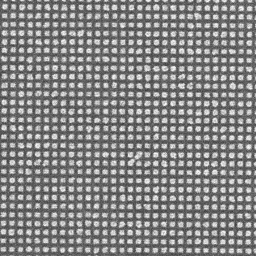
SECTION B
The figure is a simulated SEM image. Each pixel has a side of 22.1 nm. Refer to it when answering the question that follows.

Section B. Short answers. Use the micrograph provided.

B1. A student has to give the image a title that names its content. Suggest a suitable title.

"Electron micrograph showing a regular array of raised bodies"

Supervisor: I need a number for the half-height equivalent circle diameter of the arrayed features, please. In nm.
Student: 112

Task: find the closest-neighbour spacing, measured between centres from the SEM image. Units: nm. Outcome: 179